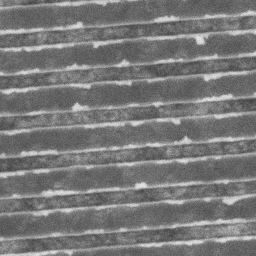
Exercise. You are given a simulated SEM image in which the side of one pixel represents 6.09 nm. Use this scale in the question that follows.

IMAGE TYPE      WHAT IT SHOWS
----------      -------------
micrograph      parallel lines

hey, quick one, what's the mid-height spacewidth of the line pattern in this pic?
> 0.0889 micrometres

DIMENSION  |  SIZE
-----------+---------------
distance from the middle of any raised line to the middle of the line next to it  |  251 nm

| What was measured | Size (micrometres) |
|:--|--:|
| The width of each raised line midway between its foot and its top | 0.166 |